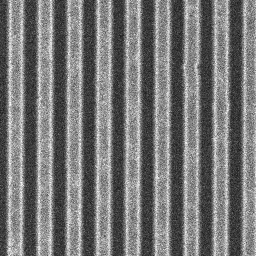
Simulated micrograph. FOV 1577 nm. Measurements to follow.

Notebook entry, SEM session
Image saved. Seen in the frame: parallel lines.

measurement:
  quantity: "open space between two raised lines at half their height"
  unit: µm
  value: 0.0886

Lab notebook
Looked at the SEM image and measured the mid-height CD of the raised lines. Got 93.9 nm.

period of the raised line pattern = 181 nanometres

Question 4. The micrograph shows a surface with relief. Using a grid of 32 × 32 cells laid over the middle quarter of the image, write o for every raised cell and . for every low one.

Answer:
.ooo....oooo....ooo....ooo....oo
.ooo....oooo....ooo....ooo....oo
.ooo....oooo....ooo....ooo....oo
.ooo....oooo....ooo....ooo....oo
.ooo....oooo....ooo....ooo....oo
.ooo....oooo....ooo....ooo....oo
.ooo....oooo....ooo....ooo....oo
.ooo....oooo....ooo....ooo....oo
.ooo....oooo....ooo....ooo....oo
.ooo....oooo....ooo....ooo....oo
.ooo....oooo....ooo....ooo....oo
.ooo....oooo....ooo....ooo....oo
.ooo....oooo....ooo....ooo....oo
.ooo....oooo....ooo....ooo....oo
.ooo....oooo....ooo....ooo....oo
.ooo....oooo....ooo....ooo....oo
.ooo....oooo....ooo....ooo....oo
.ooo....oooo...oooo....ooo....oo
.ooo....oooo...oooo....ooo....oo
.ooo....oooo...oooo....ooo....oo
.ooo....oooo...oooo....ooo....oo
.ooo....oooo...oooo....ooo....oo
.ooo....oooo...oooo....ooo....oo
.ooo....oooo...oooo....ooo....oo
.ooo....oooo...oooo....ooo....oo
.ooo....oooo...oooo....ooo....oo
.ooo....oooo...oooo....ooo....oo
.ooo....oooo...oooo....ooo....oo
.ooo....oooo...oooo....ooo....oo
.ooo....oooo...oooo....ooo....oo
.ooo....oooo...oooo....ooo....oo
.ooo....oooo...oooo....ooo....oo